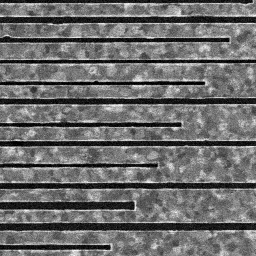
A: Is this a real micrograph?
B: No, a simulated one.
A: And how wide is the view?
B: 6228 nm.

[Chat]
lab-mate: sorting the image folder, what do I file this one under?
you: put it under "parallel lines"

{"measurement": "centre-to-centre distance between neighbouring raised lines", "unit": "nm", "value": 503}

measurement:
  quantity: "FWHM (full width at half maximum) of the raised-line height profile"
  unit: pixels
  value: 14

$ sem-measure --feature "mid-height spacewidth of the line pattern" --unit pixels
6.12